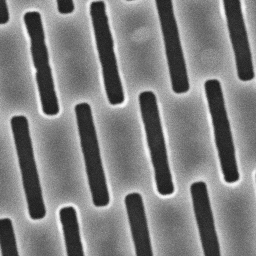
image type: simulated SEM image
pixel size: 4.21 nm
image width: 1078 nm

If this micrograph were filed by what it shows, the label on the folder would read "holes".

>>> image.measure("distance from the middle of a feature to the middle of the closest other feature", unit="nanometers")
276